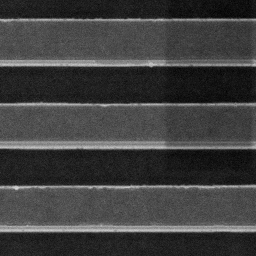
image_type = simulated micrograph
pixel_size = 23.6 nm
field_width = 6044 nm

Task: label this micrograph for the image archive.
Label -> lines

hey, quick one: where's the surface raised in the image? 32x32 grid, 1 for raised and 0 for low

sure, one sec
00000000000000000000000000000000
00000000000000000000000000000000
00000000000000000000000000000000
11111111111111111111111111111111
11111111111111111111111111111111
11111111111111111111111111111111
11111111111111111111111111111111
11111111111111111111111111111111
00000000000000000000000000000000
00000000000000000000000000000000
00000000000000000000000000000000
00000000000000000000000000000000
00000000000000000000000000000000
11111111111111111111111111111111
11111111111111111111111111111111
11111111111111111111111111111111
11111111111111111111111111111111
11111111111111111111111111111111
00000000000000000000000000000000
00000000000000000000000000000000
00000000000000000000000000000000
00000000000000000000000000000000
00000000000000000000000000000000
11111111111111111111111111111111
11111111111111111111111111111111
11111111111111111111111111111111
11111111111111111111111111111111
11111111111111111111111111111111
11111111111111111111111111111111
00000000000000000000000000000000
00000000000000000000000000000000
00000000000000000000000000000000